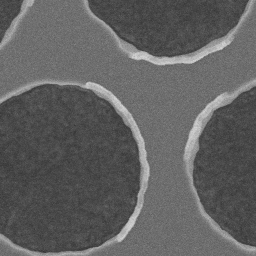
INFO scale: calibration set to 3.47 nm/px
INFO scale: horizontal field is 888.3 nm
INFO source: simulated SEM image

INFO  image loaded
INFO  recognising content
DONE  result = holes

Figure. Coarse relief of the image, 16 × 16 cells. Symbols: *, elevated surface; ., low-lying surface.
.*****.........*
.******........*
********......**
**********.*****
****************
**...***********
.......*******..
........*****...
........****....
.........***....
.........***....
.........***....
.........***....
........*****...
.......*******..
*.....**********